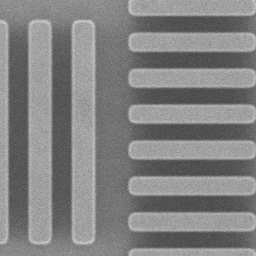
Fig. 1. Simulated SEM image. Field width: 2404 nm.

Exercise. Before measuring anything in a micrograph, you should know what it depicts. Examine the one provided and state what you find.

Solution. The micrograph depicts groups of lines, slits or small figures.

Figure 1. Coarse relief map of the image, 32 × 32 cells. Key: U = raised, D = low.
DDDDDDDDDDDDDDDDUUUUUUUUUUUUUUUU
DDDDDDDDDDDDDDDDUUUUUUUUUUUUUUUU
DDDDDDDDDDDDDDDDDDDDDDDDDDDDDDDD
UDDDUUDDDUUUDDDDDDDDDDDDDDDDDDDD
UDDDUUDDDUUUDDDDUUUUUUUUUUUUUUUU
UDDDUUDDDUUUDDDDUUUUUUUUUUUUUUUU
UDDDUUDDDUUUDDDDDDDDDDDDDDDDDDDD
UDDDUUDDDUUUDDDDDDDDDDDDDDDDDDDD
UDDDUUDDDUUUDDDDDDDDDDDDDDDDDDDD
UDDDUUDDDUUUDDDDUUUUUUUUUUUUUUUU
UDDDUUDDDUUUDDDDUUUUUUUUUUUUUUUU
UDDDUUDDDUUUDDDDDDDDDDDDDDDDDDDD
UDDDUUDDDUUUDDDDDDDDDDDDDDDDDDDD
UDDDUUDDDUUUDDDDUUUUUUUUUUUUUUUU
UDDDUUDDDUUUDDDDUUUUUUUUUUUUUUUU
UDDDUUDDDUUUDDDDDDDDDDDDDDDDDDDD
UDDDUUDDDUUUDDDDDDDDDDDDDDDDDDDD
UDDDUUDDDUUUDDDDDDDDDDDDDDDDDDDD
UDDDUUDDDUUUDDDDUUUUUUUUUUUUUUUU
UDDDUUDDDUUUDDDDUUUUUUUUUUUUUUUU
UDDDUUDDDUUUDDDDDDDDDDDDDDDDDDDD
UDDDUUDDDUUUDDDDDDDDDDDDDDDDDDDD
UDDDUUDDDUUUDDDDUUUUUUUUUUUUUUUU
UDDDUUDDDUUUDDDDUUUUUUUUUUUUUUUU
UDDDUUDDDUUUDDDDDDDDDDDDDDDDDDDD
UDDDUUDDDUUUDDDDDDDDDDDDDDDDDDDD
UDDDUUDDDUUUDDDDDDDDDDDDDDDDDDDD
UDDDUUDDDUUUDDDDUUUUUUUUUUUUUUUU
UDDDUUDDDUUUDDDDUUUUUUUUUUUUUUUU
UDDDUUDDDUUUDDDDDDDDDDDDDDDDDDDD
DDDDDDDDDDDDDDDDDDDDDDDDDDDDDDDD
DDDDDDDDDDDDDDDDUUUUUUUUUUUUUUUU